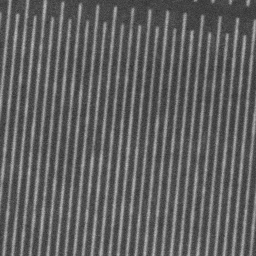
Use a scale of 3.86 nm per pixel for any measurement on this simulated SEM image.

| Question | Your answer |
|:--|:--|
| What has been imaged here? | parallel lines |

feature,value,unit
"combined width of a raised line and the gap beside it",33.9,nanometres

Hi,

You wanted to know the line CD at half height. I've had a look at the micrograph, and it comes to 7.2 nanometers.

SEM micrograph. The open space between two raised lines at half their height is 0.025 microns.